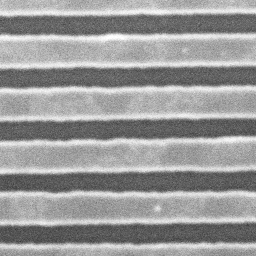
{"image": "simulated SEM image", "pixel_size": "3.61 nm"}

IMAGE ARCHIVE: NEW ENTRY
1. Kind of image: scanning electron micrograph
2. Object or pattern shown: lines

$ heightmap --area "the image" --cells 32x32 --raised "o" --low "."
oooooooooooooooooooooooooooooooo
ooooooooooooooooooooooooooooo.oo
................................
................................
o.....o......ooooooooooooooooooo
oooooooooooooooooooooooooooooooo
oooooooooooooooooooooooooooooooo
oooooooooooooooooooooooooooooooo
................................
................................
................................
oooooooooooooooooooooooooooooooo
oooooooooooooooooooooooooooooooo
oooooooooooooooooooooooooooooooo
oooooooooooooooooooooooooooooooo
................................
................................
...............o.....ooooooooooo
oooooooooooooooooooooooooooooooo
oooooooooooooooooooooooooooooooo
oooooooooooooooooooooooooooooooo
oooooooo........................
................................
................................
oooooooooooooooooooooooooooooooo
oooooooooooooooooooooooooooooooo
oooooooooooooooooooooooooooooooo
oooooooooooooooooooooooooooooooo
................................
................................
................................
oooooooooooooooooooooooooooooooo